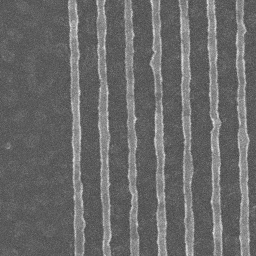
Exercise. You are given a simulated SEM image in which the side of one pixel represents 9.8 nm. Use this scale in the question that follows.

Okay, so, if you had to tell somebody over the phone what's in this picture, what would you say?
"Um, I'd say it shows parallel lines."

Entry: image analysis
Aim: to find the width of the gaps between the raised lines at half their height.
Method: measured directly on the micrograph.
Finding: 198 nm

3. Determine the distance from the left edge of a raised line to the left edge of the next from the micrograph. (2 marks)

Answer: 0.272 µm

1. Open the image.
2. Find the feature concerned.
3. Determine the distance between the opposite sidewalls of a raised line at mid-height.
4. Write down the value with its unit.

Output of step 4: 70.4 nanometers